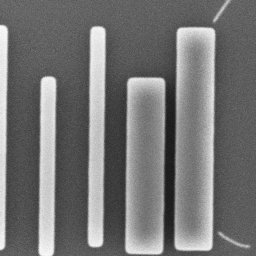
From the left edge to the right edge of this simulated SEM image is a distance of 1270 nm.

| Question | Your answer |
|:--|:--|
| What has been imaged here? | groups of lines, slits or small figures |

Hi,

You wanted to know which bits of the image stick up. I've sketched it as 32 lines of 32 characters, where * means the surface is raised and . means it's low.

................................
................................
................................
*...........*...................
*..........**.........*****.....
*..........**.........*****.....
*..........**.........*****.....
*..........**.........*****.....
*..........**.........*****.....
*..........**.........*****.....
*....**....**...*****.*****.....
*....**....**...*****.*****.....
*....**....**...*****.*****.....
*....**....**...*****.*****.....
*....**....**...*****.*****.....
*....**....**...*****.*****.....
*....**....**...*****.*****.....
*....**....**...*****.*****.....
*....**....**...*****.*****.....
*....**....**...****..*****.....
*....**....**...****..*****.....
*....**....**...****..*****.....
*....**....**...****..*****.....
*....**....**...****..*****.....
*....**....**...****..*****.....
*....**....**...****..*****.....
*....**....**...****..*****.....
*....**....**...****..*****.....
*....**....**...****..*****.....
*....**....**...****..*****.....
*....**....**...****..****......
.....**.........****............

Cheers